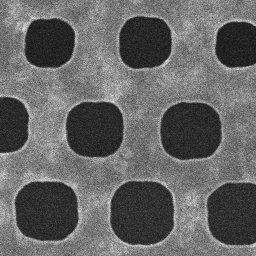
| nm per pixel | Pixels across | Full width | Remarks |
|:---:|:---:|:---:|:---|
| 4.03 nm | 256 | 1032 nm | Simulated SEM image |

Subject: holes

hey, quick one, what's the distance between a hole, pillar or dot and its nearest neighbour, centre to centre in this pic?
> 95 px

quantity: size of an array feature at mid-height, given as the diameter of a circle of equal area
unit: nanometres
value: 245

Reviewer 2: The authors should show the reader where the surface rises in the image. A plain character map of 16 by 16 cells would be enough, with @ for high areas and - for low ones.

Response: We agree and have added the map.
@@@@@@@@@@@@@@@@
@@--@@@@--@@@@--
@@---@@----@@@--
@@--@@@@---@@@--
@@@@@@@@@@@@@@@@
@@@@@@@@@@@@@@@@
-@@@@--@@@@--@@@
--@@----@@----@@
--@@----@@----@@
-@@@@--@@@---@@@
@@@@@@@@@@@@@@@@
@@--@@@@--@@@@--
@----@@----@@---
@----@@----@@---
@---@@@----@@---
@@@@@@@@@@@@@@@@